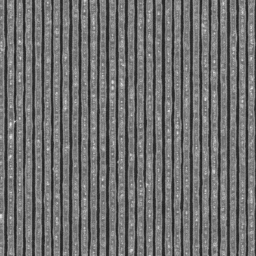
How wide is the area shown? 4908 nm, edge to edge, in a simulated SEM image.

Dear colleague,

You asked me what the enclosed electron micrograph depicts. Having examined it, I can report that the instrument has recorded parallel lines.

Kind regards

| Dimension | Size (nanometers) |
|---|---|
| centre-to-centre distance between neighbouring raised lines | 177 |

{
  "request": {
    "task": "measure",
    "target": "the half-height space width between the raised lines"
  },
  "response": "52.7 nm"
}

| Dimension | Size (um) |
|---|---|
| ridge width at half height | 0.12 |